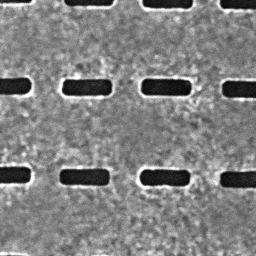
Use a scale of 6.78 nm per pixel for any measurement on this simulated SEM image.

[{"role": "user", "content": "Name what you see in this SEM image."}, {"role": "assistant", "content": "holes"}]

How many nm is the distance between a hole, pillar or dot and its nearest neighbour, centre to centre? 538